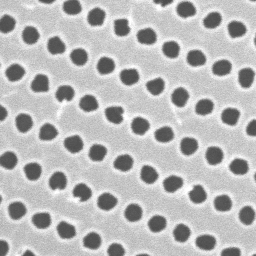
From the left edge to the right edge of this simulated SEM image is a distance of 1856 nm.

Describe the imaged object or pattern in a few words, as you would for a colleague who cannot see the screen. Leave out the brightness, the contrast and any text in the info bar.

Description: a regular array of holes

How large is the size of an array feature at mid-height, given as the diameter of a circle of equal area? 137 nm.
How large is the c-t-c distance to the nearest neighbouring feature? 0.192 um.